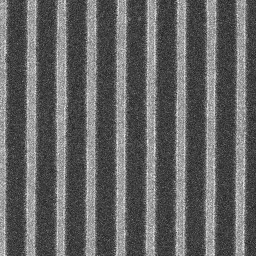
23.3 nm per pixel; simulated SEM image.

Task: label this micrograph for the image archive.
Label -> parallel lines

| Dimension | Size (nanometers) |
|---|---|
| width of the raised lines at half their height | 542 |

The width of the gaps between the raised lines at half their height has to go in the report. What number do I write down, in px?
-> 6.63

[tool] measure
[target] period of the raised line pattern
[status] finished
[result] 698 nanometers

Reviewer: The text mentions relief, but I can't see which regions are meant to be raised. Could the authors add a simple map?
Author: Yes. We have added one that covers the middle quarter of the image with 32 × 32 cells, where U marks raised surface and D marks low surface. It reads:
UUUUUUDDUUUUUDDUUUUUUDDUUUUUDDUU
UUUUUUDDUUUUUDDUUUUUUDDUUUUUDDUU
UUUUUUDDUUUUUDDUUUUUUDDUUUUUDDUU
UUUUUUDDUUUUUDDUUUUUUDDUUUUUDDUU
UUUUUUDDUUUUUDDUUUUUUDDUUUUUDDUU
UUUUUUDDUUUUUDDUUUUUUDDUUUUUDDUU
UUUUUUDDUUUUUDDUUUUUUDDUUUUUDDUU
UUUUUUDDUUUUUDDUUUUUUDDUUUUUDDUU
UUUUUUDDUUUUUDDUUUUUUDDUUUUUDDUU
UUUUUUDDUUUUUDDUUUUUUDDUUUUUDDUU
UUUUUUDDUUUUUDDUUUUUUDDUUUUUDDUU
UUUUUUDDUUUUUDDUUUUUUDDUUUUUDDUU
UUUUUUDDUUUUUDDUUUUUUDDUUUUUDDUU
UUUUUUDDUUUUUDDUUUUUUDDUUUUUDDUU
UUUUUUDDUUUUUDDUUUUUUDDUUUUUDDUU
UUUUUUDDUUUUUDDUUUUUUDDUUUUUDDUU
UUUUUUDDUUUUUDDUUUUUUDDUUUUUDDUU
UUUUUUDDUUUUUDDUUUUUUDDUUUUUDDUU
UUUUUUDDUUUUUDDUUUUUUDDUUUUUDDUU
UUUUUUDDUUUUUDDUUUUUUDDUUUUUDDUU
UUUUUUDDUUUUUDDUUUUUUDDUUUUUDDUU
UUUUUUDDUUUUUDDUUUUUUDDUUUUUDDUU
UUUUUUDDUUUUUDDUUUUUUDDUUUUUDDUU
UUUUUUDDUUUUUDDUUUUUUDDUUUUUDDUU
UUUUUUDDUUUUUDDUUUUUUDDUUUUUDDUU
UUUUUUDDUUUUUDDUUUUUUDDUUUUUDDUU
UUUUUUDDUUUUUDDUUUUUUDDUUUUUDDUU
UUUUUUDDUUUUUDDUUUUUUDDUUUUUDDUU
UUUUUUDDUUUUUDDUUUUUUDDUUUUUDDUU
UUUUUUDDUUUUUDDUUUUUUDDUUUUUDDUU
UUUUUUDDUUUUUDDUUUUUUDDUUUUUDDUU
UUUUUUDDUUUUUDDUUUUUUDDUUUUUDDUU